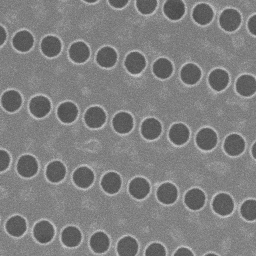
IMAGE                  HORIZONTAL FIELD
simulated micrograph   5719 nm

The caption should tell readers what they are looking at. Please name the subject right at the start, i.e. a regular array of holes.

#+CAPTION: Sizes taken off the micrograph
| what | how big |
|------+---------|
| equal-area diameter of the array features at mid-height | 489 nm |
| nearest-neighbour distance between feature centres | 631 nanometres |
